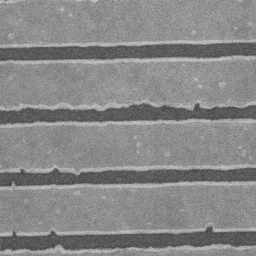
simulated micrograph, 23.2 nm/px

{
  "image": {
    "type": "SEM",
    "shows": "one or a few lines or trenches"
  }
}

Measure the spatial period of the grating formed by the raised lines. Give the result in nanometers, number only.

1450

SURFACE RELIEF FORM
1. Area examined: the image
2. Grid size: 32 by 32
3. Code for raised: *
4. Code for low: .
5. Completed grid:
********************************
********************************
********************************
********************************
********************************
***********..**.................
................................
...........................*****
********************************
********************************
********************************
********************************
********************************
**..............................
................................
....**.*...*.*******************
********************************
********************************
********************************
********************************
********************************
.........*......................
................................
.*....**************************
********************************
********************************
********************************
********************************
*************************..*****
................................
................................
.***.***..**********************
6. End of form